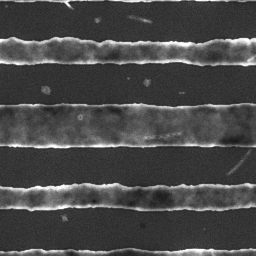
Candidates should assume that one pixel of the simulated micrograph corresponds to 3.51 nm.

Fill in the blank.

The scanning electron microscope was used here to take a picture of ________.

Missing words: lines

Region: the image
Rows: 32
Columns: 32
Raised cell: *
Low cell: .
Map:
................................
................................
................................
................................
................................
********************************
********************************
********************************
................................
................................
................................
................................
................................
********************************
********************************
********************************
********************************
********************************
................................
................................
................................
................................
................................
**..****************************
********************************
********************************
................................
................................
................................
................................
................................
********************************